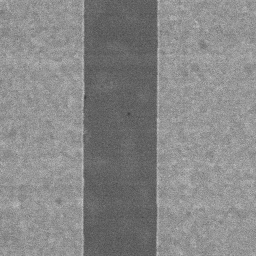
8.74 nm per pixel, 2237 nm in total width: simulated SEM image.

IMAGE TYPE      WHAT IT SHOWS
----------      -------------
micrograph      one or a few lines or trenches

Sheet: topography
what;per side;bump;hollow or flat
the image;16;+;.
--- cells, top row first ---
+++++.....++++++
+++++.....++++++
+++++.....++++++
+++++.....++++++
+++++.....++++++
+++++.....++++++
+++++.....++++++
+++++.....++++++
+++++.....++++++
+++++.....++++++
+++++.....++++++
+++++.....++++++
+++++.....++++++
+++++.....++++++
+++++.....++++++
+++++.....++++++